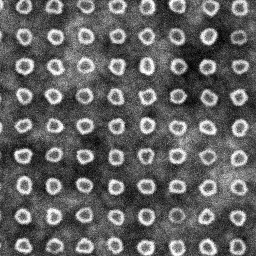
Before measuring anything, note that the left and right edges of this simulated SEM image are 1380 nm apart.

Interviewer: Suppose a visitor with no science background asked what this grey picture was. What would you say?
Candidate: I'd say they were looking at a regular array of raised bodies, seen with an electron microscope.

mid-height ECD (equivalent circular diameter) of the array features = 0.0826 micrometres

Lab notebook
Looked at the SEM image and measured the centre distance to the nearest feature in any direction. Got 0.159 micrometres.